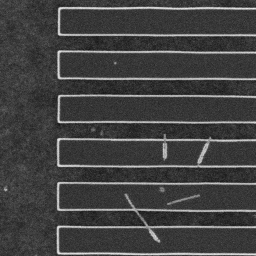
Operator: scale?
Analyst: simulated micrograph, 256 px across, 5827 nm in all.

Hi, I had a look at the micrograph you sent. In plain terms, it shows groups of lines, slits or small figures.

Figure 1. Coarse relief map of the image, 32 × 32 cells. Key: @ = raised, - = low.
--------------------------------
-------@@@@@@@@@@@@@@@@@@@@@@@@@
-------@@@@@@@@@@@@@@@@@@@@@@@@@
-------@@@@@@@@@@@@@@@@@@@@@@@@@
--------------------------------
--------------------------------
--------@@@@@@----@@@@----------
-------@@@@@@@@@@@@@@@@@@@@@@@@@
-------@@@@@@@@@@@@@@@@@@@@@@@@@
-------@@@@@@@@@@@@@@@@@@@@@@@@@
--------------------------------
--------------------------------
-------@@@@@@@@@@@@@@@@@@@@@@@@@
-------@@@@@@@@@@@@@@@@@@@@@@@@@
-------@@@@@@@@@@@@@@@@@@@@@@@@@
--------------------------------
--------------------------------
--------@@@@@@@@@@@@@-----@-----
-------@@@@@@@@@@@@@@@@@@@@@@@@@
-------@@@@@@@@@@@@@@@@@@@@@@@@@
-------@@@@@@@@@@@@@@@@@@@@@@@@@
--------------------------------
--------------------------------
-------@@@@@@@@@@@@@@@@@@@@@@@@@
-------@@@@@@@@@@@@@@@@@@@@@@@@@
-------@@@@@@@@@@@@@@@@@@@@@@@@@
--------------------------------
--------------------------------
-------@@@@@@@@@@@@@@@@@@@@@@@@@
-------@@@@@@@@@@@@@@@@@@@@@@@@@
-------@@@@@@@@@@@@@@@@@@@@@@@@@
--------@@@@@@@@@@@@@@@@@@@@@@@@